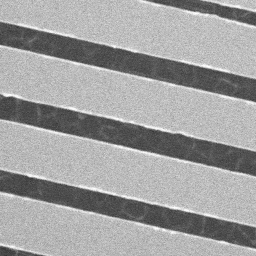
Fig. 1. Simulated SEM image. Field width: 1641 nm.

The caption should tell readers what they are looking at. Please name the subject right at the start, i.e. one or a few lines or trenches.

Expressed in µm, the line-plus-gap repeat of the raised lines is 0.466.